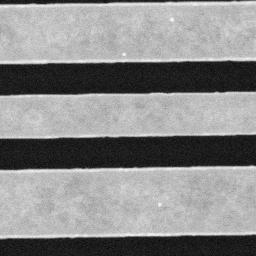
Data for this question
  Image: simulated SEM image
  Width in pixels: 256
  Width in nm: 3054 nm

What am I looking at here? lines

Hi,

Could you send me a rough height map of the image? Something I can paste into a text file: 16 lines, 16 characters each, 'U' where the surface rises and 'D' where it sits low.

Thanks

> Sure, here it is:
UUUUUUUUUUUUUUUU
UUUUUUUUUUUUUUUU
UUUUUUUUUUUUUUUU
UUUUUUUUUUUUUUUU
DDDDDDDDDDDDDDDD
DDDDDDDDDDDDDDDD
UUUUUUUUUUUUUUUU
UUUUUUUUUUUUUUUU
UUUUUUDDDDDDDDDD
DDDDDDDDDDDDDDDD
DDDDDDDDDUUUUUUU
UUUUUUUUUUUUUUUU
UUUUUUUUUUUUUUUU
UUUUUUUUUUUUUUUU
UUUUUUUUUUUUUUUU
DDDDDDDDDDDDDDDD